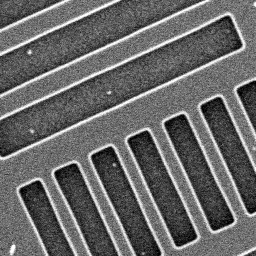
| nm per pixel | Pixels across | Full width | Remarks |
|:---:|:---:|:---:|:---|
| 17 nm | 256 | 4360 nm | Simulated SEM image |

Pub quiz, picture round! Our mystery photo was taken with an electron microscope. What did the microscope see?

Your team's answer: groups of lines, slits or small figures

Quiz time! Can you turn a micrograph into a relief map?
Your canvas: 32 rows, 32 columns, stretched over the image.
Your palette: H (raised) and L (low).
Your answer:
LLLLLLLHHHHHHHLLLLLLLLLLLHHHHHHH
LLLLLHHHHHHHLLLLLLLLLLLHHHHHHHHH
LLLHHHHHHHLLLLLLLLLLLHHHHHHLLHHH
LHHHHHHLLLLLLLLLLLHHHHHHHLLLLLHH
HHHHHLLLLLLLLLLLHHHHHHHLLLLLLLHH
HHHLLLLLLLLLLLHHHHHHHLLLLLLLLLHH
HLLLLLLLLLLLHHHHHHLLLLLLLLLLLHHH
LLLLLLLLLHHHHHHHLLLLLLLLLLLHHHHH
LLLLLLLHHHHHHHLLLLLLLLLLLHHHHHHH
LLLLLHHHHHHHLLLLLLLLLLLHHHHHHHHH
LLLHHHHHHLLLLLLLLLLLLHHHHHHHHHHL
LHHHHHHLLLLLLLLLLLHHHHHHHHHHHHLL
HHHHHLLLLLLLLLLLHHHHHHHHHHLLHHLL
HHHLLLLLLLLLLLHHHHHHHHHHHLLLHHLL
HLLLLLLLLLLLHHHHHHHHHHLHHLLLLHHL
LLLLLLLLLLHHHHHHHHHHHLLLHHLLLHHL
LLLLLLLLHHHHHHHHHHLHHLLLHHLLLLHH
LLLLLHHHHHHHHHHHLLLHHLLLLHHLLLHH
LLLHHHHHHHHHHLHHLLLLHHLLLHHLLLLH
LHHHHHHHHHHLLLLHHLLLHHLLLLHHLLLH
HHHHHHHHLLHHLLLHHLLLLHHLLLHHLLLL
HHHHHHHLLLHHLLLLHHLLLHHLLLLHHLLL
HHHHHHHLLLLHLLLLHHLLLLHHLLLHHLLL
HHHLLLHLLLLHHLLLLHHLLLHHLLLHHHLL
HHHLLLHHLLLLHLLLLHHLLLHHLLLLHHLL
HHHLLLHHLLLLHHLLLHHLLLLHHLLLHHLL
HHHLLLLHHLLLHHLLLLHHLLLHHLLLLHHL
HHHHLLLHHLLLLHHLLLHHLLLLHHLLLHHH
HHHHLLLLHHLLLHHLLLLHHLLLHHLLHHHH
HHHHHLLLHHLLLLHHLLLHHLLLLHHHHHHH
HHHHHLLLLHHLLLHHLLLLHHLHHHHHHHHH
HHHHHHLLLHHLLLLHHLLLHHHHHHHHHHHL